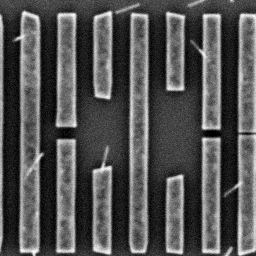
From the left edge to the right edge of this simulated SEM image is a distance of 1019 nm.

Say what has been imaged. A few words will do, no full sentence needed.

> wiring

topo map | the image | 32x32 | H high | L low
LLLLLLLLLLLLLLLLLLLLLLLLLLLLLLLL
LLLLLLLLLLLLLLLLLLLLLLLLLLLLLLLL
LLLHHLLHHLLLHHLLHHLLLHHLLHHLLLHH
LLLHHLLHHLLLHHLLHHLLLHHLLHHLLLHH
LLLHHLLHHLLLHHLLHHLLLHHLLHHLLLHH
LLLHHLLHHLLLHHLLHHLLLHHLLHHLLLHH
LLLHHLLHHLLLHHLLHHLLLHHLLHHLLLHH
LLLHHLLHHLLLHHLLHHLLLHHLLHHLLLHH
LLLHHLLHHLLLHHLLHHLLLHHLLHHLLLHH
LLLHHLLHHLLLHHLLHHLLLHHLLHHLLLHH
LLLHHLLHHLLLHHLLHHLLLHHLLHHLLLHH
LLLHHLLHHLLLHHLLHHLLLLLLLHHLLLHH
LLLHHLLHHLLLLLLLHHLLLLLLLHHLLLHH
LLLHHLLHHLLLLLLLHHLLLLLLLHHLLLHH
LLLHHLLHHLLLLLLLHHLLLLLLLHHLLLHH
LLLHHLLHHLLLLLLLHHLLLLLLLHHLLLHH
LLLHHLLLLLLLLLLLHHLLLLLLLLLLLLHH
LLLHHLLLLLLLLLLLHHLLLLLLLLHLLLHH
LLLHHLLHHLLLLLLLHHLLLLLLLHHLLLHH
LLLHHLLHHLLLLLLLHHLLLLLLLHHLLLHH
LLLHHLLHHLLLLLLLHHLLLLLLLHHLLLHH
LLLHHLLHHLLLHHLLHHLLLLLLLHHLLLHH
LLLHHLLHHLLLHHLLHHLLLHHLLHHLLLHH
LLLHHLLHHLLLHHLLHHLLLHHLLHHLLLHH
LLLHHLLHHLLLHHLLHHLLLHHLLHHLLLHH
LLLHHLLHHLLLHHLLHHLLLHHLLHHLLLHH
LLLHHLLHHLLLHHLLHHLLLHHLLHHLLLHH
LLLHHLLHHLLLHHLLHHLLLHHLLHHLLLHH
LLLHHLLHHLLLHHLLHHLLLHHLLHHLLLHH
LLLHHLLHHLLLHHLLHHLLLHHLLHHLLLHH
LLLHHLLHHLLLHHLLHHLLLHHLLHHLLLHH
LLLLHLLLLLLLLHLLLLLLLHLLLLHLLLHL